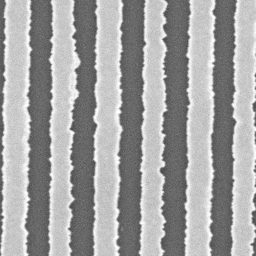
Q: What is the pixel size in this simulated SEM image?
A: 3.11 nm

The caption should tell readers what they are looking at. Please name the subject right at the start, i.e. lines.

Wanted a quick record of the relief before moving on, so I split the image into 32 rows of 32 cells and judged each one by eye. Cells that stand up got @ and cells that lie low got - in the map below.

-@@@---@@---@@@---@@@---@@@---@@
-@@@---@@---@@@---@@@---@@@--@@@
-@@@---@@---@@@---@@@---@@@--@@@
-@@@---@@---@@@---@@----@@@--@@@
-@@@---@@---@@@---@@@---@@@--@@@
-@@@---@@---@@@---@@@---@@@--@@@
-@@@---@@---@@@---@@@--@@@@--@@@
-@@@--@@@@--@@@---@@----@@@--@@@
-@@@---@@@--@@@---@@----@@---@@@
-@@----@@---@@@---@@@---@@---@@@
-@@----@@---@@@---@@@---@@---@@@
@@@----@@@--@@@---@@@---@@@--@@@
-@@----@@---@@@---@@@---@@@--@@@
@@@----@@---@@@---@@@---@@@--@@@
@@@---@@@---@@@---@@----@@@--@@@
-@@@--@@@---@@@---@@----@@@--@@@
-@@---@@@---@@@---@@---@@@---@@@
@@@---@@@---@@@---@@---@@@---@@@
@@@---@@@---@@@---@@----@@---@@@
@@@---@@@---@@@---@@----@@---@@@
@@@---@@@---@@@---@@----@@---@@@
@@@---@@@---@@@---@@---@@@@--@@@
@@@---@@@---@@@---@@@--@@@---@@@
@@@---@@@---@@@---@@---@@@---@@@
@@@---@@@---@@@---@@---@@@---@@@
@@@---@@@---@@----@@---@@@---@@@
@@@---@@@---@@@---@@---@@@---@@@
@@@---@@@---@@@---@@@--@@@---@@-
@@@---@@@---@@@---@@---@@@---@@@
@@@---@@@---@@@---@@---@@@---@@@
@@@---@@@---@@@---@@---@@@---@@@
@@@---@@@---@@@---@@---@@@---@@@